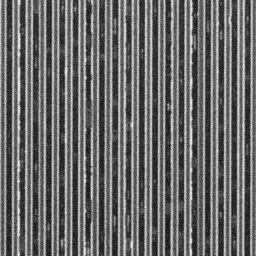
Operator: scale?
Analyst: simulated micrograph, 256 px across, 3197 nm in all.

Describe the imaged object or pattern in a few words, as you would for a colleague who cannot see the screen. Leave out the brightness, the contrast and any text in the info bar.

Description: parallel lines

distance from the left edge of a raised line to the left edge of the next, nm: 165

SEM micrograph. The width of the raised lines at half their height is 73.4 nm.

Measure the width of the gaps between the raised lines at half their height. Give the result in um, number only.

0.0968